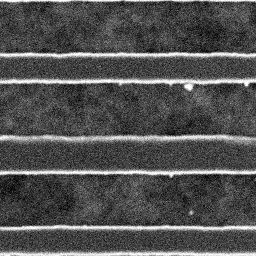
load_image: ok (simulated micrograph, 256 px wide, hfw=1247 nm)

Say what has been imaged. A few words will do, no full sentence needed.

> lines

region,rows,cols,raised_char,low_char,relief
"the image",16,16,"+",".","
................
................
................
++++++++++++++++
++++++++++++++++
................
................
................
.............+..
++++++++++++++++
++++++++++++++++
................
................
................
++++++++++++++++
++++++++++++++++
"